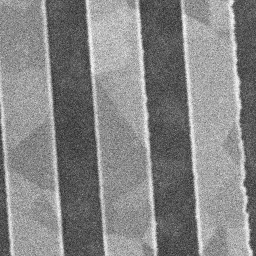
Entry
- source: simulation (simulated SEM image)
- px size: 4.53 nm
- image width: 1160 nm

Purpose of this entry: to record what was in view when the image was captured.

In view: one or a few lines or trenches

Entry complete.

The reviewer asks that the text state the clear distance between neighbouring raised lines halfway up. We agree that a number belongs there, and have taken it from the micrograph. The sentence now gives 198 nanometres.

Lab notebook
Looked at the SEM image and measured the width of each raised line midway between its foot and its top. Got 225 nm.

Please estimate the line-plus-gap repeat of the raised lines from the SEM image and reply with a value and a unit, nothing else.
0.425 micrometres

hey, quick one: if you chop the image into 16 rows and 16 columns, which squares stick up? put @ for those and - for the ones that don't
@@@---@@@--@@@--
@@@---@@@---@@@-
@@@---@@@---@@@-
@@@---@@@---@@@-
@@@---@@@---@@@-
@@@---@@@---@@@-
@@@---@@@---@@@-
@@@---@@@---@@@-
@@@---@@@---@@@-
@@@---@@@---@@@-
@@@---@@@---@@@-
@@@@--@@@---@@@-
-@@@--@@@---@@@-
-@@@--@@@@--@@@-
-@@@---@@@--@@@-
-@@@---@@@---@@@